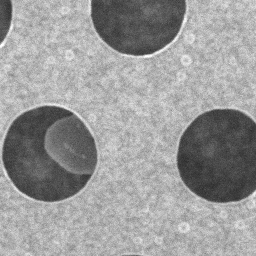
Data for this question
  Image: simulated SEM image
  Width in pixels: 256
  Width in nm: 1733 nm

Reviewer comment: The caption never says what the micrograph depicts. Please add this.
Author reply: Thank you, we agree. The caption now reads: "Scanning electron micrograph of holes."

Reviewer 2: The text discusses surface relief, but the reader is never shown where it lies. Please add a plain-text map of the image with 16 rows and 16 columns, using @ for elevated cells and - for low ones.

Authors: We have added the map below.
-@@@@@------@@@@
-@@@@@-----@@@@@
@@@@@@-----@@@@@
@@@@@@@@@@@@@@@@
@@@@@@@@@@@@@@@@
@@@@@@@@@@@@@@@@
@@@@@@@@@@@@@@@@
@----@@@@@@@----
------@@@@@-----
------@@@@@-----
------@@@@@-----
@----@@@@@@@----
@@--@@@@@@@@@--@
@@@@@@@@@@@@@@@@
@@@@@@@@@@@@@@@@
@@@@@@@@@@@@@@@@